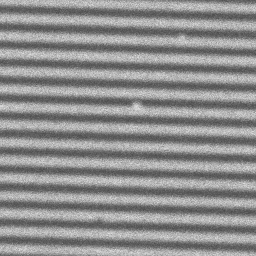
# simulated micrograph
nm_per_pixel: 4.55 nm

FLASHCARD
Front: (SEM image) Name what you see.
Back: parallel lines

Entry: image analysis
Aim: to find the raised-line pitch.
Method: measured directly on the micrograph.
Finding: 80.7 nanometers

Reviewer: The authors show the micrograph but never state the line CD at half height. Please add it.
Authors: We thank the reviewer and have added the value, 0.0415 microns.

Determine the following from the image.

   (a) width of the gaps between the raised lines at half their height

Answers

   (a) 37.5 nanometers